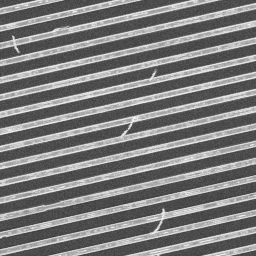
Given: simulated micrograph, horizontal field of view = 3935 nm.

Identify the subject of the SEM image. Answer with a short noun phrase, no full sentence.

parallel lines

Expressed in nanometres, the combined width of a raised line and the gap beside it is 258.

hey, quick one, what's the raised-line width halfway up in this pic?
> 86.3 nm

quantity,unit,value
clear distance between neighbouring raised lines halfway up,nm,172